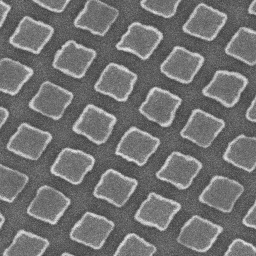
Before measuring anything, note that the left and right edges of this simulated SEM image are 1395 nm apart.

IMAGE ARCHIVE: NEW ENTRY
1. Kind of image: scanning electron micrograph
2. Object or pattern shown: a regular array of raised bodies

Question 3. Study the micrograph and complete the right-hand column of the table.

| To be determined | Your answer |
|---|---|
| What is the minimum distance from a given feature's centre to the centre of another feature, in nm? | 255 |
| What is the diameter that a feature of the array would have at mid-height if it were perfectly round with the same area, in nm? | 196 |